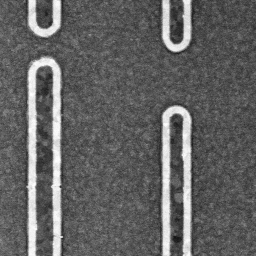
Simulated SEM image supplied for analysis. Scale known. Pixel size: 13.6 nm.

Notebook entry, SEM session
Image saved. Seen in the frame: one or a few lines or trenches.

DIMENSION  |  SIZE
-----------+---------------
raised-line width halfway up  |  312 nm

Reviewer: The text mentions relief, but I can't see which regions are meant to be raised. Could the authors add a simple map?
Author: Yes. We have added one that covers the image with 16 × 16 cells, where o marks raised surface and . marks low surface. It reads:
..oo......oo....
..o.......oo....
..........oo....
................
..oo............
..oo............
..oo............
..oo......oo....
..oo......oo....
..oo......oo....
..oo......oo....
..oo......oo....
..oo......oo....
..oo......oo....
..oo......oo....
..oo......oo....